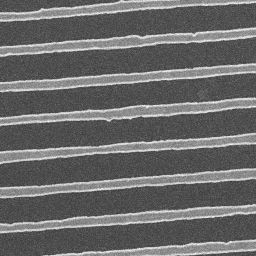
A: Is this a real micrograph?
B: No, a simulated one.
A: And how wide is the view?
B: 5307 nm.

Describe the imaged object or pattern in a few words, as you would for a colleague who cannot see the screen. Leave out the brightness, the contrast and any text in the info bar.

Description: parallel lines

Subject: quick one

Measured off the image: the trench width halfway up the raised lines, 0.561 um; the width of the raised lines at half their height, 178 nm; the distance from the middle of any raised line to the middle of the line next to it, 730 nm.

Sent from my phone